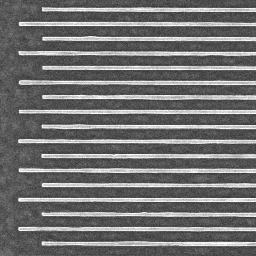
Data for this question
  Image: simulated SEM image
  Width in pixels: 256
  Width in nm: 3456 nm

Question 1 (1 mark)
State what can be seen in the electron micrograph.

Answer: parallel lines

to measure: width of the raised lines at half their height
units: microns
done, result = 0.0422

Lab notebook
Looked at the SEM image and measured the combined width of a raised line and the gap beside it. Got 198 nanometres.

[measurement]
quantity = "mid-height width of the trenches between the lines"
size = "148 nm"